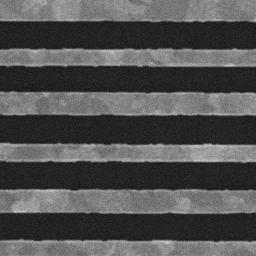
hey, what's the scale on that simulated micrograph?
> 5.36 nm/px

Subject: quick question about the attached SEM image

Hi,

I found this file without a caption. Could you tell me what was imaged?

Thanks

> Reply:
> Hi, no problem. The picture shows lines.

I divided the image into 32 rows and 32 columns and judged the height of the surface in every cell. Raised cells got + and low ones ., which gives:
++++++++++++++++++++++++++++++++
++++++++++++++++++++++++++++++++
++++++++++++++++++++++++++++++++
................................
................................
................................
++++++++++++++++++++++++++++++++
++++++++++++++++++++++++++++++++
................................
................................
................................
................................
++++++++++++++++++++++++++++++++
++++++++++++++++++++++++++++++++
................................
................................
................................
................................
++++++++++++++++++++++++++++++++
++++++++++++++++++++++++++++++++
................................
................................
................................
................................
++++++++++++++++++++++++++++++++
++++++++++++++++++++++++++++++++
...........+++++++++++++++++++++
................................
................................
................................
++++++++++++++++++++++++++++++++
++++++++++++++++++++++++++++++++